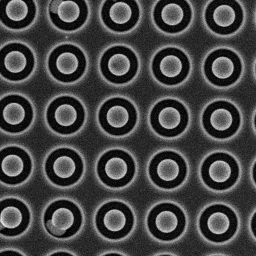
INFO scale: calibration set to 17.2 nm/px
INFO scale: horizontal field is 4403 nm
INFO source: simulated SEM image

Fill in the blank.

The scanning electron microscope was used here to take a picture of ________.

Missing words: an array of small figures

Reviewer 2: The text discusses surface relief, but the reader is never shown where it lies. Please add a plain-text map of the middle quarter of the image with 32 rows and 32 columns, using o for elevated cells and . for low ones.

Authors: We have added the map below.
ooo...ooo..ooooo...ooo..ooooo...
ooo..oooo..ooooo...ooo..ooooo...
.....oooo...ooo...oooo...oooo..o
....oooooo.......oooooo........o
...oooooooo.....oooooooo......oo
oooooooooooooooooooooooooo.ooooo
oooooooooooooooooooooooooooooooo
oooooooooooooooooooooooooooooooo
...oooooooo....ooooooooooo.ooooo
....oooooo.......oooooo......ooo
oo...oooo.........oooo........oo
ooo..oooo..oooo...oooo...ooo...o
ooo...oo...ooooo...oo...ooooo..o
ooo..ooo...ooooo..ooo...ooooo..o
oo...oooo..ooooo..ooo...ooooo..o
.....oooo...ooo...oooo...ooo...o
....oooooo.......ooooo........oo
..ooooooooo.....ooooooo......ooo
ooooooooooooooooooooooooo..ooooo
oooooooooooooooooooooooooooooooo
oooooooooooooooooooooooooooooooo
...oooooooo....oooooooooo..ooooo
....oooooo.......oooooo......ooo
o....oooo........ooooo........oo
oo...ooo...oooo...ooo...oooo...o
ooo..ooo...ooooo..ooo...oooo...o
ooo..ooo...ooooo..ooo...oooo...o
oo...ooo...oooo...ooo...oooo...o
....ooooo...oo...oooo...oooo...o
...oooooo........ooooo........oo
..ooooooooo....oooooooo......ooo
ooooooooooooooooooooooooo.oooooo